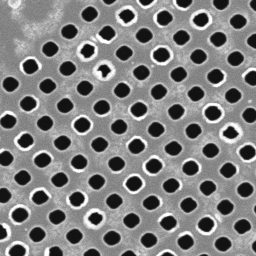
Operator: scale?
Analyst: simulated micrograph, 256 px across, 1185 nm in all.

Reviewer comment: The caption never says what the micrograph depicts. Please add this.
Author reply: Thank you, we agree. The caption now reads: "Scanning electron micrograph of a regular array of holes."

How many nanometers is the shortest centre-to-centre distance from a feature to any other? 120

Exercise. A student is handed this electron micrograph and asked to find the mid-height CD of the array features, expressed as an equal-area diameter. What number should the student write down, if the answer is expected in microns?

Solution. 0.0684